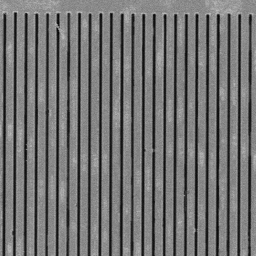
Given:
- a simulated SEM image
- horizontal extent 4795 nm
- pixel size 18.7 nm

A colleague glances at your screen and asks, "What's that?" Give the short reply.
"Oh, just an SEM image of parallel lines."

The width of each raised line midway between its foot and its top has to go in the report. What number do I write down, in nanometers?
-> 140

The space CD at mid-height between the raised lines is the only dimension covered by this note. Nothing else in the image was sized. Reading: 53.8 nanometers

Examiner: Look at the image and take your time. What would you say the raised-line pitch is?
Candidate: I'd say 200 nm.